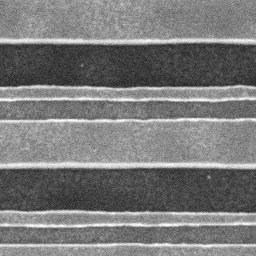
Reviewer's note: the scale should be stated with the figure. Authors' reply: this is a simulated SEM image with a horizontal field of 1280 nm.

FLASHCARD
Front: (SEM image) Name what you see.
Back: lines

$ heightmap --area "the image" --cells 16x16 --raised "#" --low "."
################
################
################
................
................
#######.########
################
################
################
################
................
................
................
################
################
################